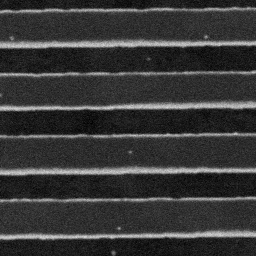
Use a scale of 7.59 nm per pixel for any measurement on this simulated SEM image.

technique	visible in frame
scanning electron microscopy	lines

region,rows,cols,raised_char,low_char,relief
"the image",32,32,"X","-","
--------------------------------
XXXXXXXXXXXXXXXXXXXXXXXXXXXXXXXX
XXXXXXXXXXXXXXXXXXXXXXXXXXXXXXXX
XXXXXXXXXXXXXXXXXXXXXXXXXXXXXXXX
XXXXXXXXXXXXXXXXXXXXXXXXXXXXXXXX
XXXXXXXXXXXXXXXXXXXXXXXXXX------
--------------------------------
--------------------------------
--------------------------------
XXXXXXXXXXXXXXXXXXXXXXXXXXXXXXXX
XXXXXXXXXXXXXXXXXXXXXXXXXXXXXXXX
XXXXXXXXXXXXXXXXXXXXXXXXXXXXXXXX
XXXXXXXXXXXXXXXXXXXXXXXXXXXXXXXX
XXXXXXXXXXXXXXX-----------------
--------------------------------
--------------------------------
--------------------------------
XXXXXXXXXXXXXXXXXXXXXXXXXXXXXXXX
XXXXXXXXXXXXXXXXXXXXXXXXXXXXXXXX
XXXXXXXXXXXXXXXXXXXXXXXXXXXXXXXX
XXXXXXXXXXXXXXXXXXXXXXXXXXXXXXXX
XXXXXXXXXX--X-------------------
--------------------------------
--------------------------------
--------------------------------
XXXXXXXXXXXXXXXXXXXXXXXXXXXXXXXX
XXXXXXXXXXXXXXXXXXXXXXXXXXXXXXXX
XXXXXXXXXXXXXXXXXXXXXXXXXXXXXXXX
XXXXXXXXXXXXXXXXXXXXXXXXXXXXXXXX
XXXXXXXXXXXXXXXXXXXXXXXXX-------
--------------------------------
--------------------------------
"